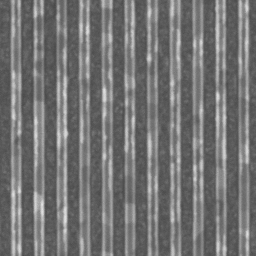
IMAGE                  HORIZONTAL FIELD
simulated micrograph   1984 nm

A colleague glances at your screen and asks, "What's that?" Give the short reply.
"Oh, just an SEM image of parallel lines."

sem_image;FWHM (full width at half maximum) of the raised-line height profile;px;8.5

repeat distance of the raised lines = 176 nm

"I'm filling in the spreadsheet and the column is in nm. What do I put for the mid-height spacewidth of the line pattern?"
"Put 111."